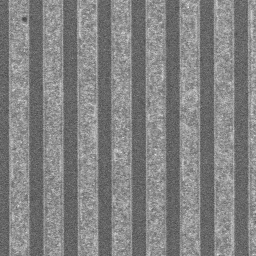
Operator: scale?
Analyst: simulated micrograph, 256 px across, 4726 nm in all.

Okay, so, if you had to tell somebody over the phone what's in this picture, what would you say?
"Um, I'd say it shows parallel lines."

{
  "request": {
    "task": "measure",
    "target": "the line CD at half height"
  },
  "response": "353 nm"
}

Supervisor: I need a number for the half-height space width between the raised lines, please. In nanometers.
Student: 270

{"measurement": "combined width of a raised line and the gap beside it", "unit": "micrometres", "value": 0.631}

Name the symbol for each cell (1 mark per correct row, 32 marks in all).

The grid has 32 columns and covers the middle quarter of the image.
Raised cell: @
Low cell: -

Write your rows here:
----@@@@----@@@@@----@@@@----@@@
----@@@@----@@@@@----@@@@----@@@
----@@@@----@@@@@----@@@@----@@@
----@@@@----@@@@@----@@@@----@@@
----@@@@----@@@@@----@@@@----@@@
----@@@@----@@@@@----@@@@----@@@
----@@@@----@@@@@----@@@@----@@@
----@@@@----@@@@@----@@@@----@@@
----@@@@----@@@@@----@@@@----@@@
----@@@@----@@@@@----@@@@----@@@
----@@@@----@@@@@----@@@@----@@@
----@@-@----@@@@@----@@@@----@@@
----@@@@----@@@@@----@@@@----@@@
----@@@@----@@@@@----@@@@----@@@
----@@@@----@@@@@----@@@@----@@@
----@@@@----@@@@@----@@@@----@@@
----@@@@----@@@@@----@@@@----@@@
----@@@@----@@@@@----@@@@----@@@
----@@@@----@@@@@----@@@@----@@@
----@@@@----@@@@@----@@@@----@@@
----@@@@----@@@@@----@@@@----@@@
----@@@@----@@@@@----@@@@----@@@
----@@@@----@@@@@----@@@@----@@@
----@@@@----@@@@@----@@@@----@@@
----@@@@----@@@@@----@@@@----@@@
----@@@@----@@@@@----@@@@----@@@
----@@@@----@@@@@----@@@@----@@@
----@@@@----@@@@@----@@@@----@@@
----@@@@----@@@@@----@@@@----@@@
----@@@@----@@@@@----@@@@----@@@
----@@@@----@@@@@----@@@@----@@@
----@@@@----@@@@@----@@@@----@@@